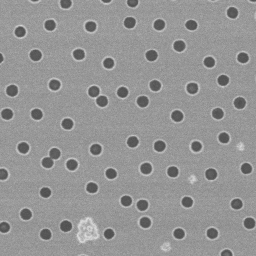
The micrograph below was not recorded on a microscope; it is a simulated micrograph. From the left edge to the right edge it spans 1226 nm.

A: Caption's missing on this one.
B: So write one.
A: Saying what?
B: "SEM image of a regular array of holes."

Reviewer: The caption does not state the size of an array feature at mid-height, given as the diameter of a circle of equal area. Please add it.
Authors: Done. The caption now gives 58 nm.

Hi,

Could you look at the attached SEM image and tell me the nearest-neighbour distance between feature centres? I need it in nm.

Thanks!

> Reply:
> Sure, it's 135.